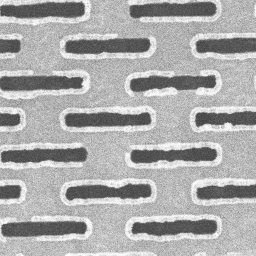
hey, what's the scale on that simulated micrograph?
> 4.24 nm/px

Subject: a regular array of holes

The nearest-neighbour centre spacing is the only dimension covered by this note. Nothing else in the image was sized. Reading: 308 nanometers